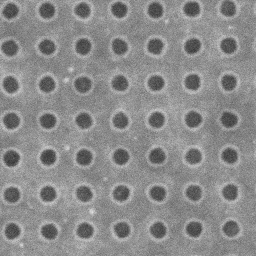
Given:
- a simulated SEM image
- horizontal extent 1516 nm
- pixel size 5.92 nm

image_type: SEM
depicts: a regular array of holes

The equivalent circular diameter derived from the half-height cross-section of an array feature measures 108 nm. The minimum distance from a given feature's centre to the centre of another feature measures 36.1 px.